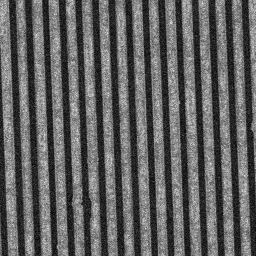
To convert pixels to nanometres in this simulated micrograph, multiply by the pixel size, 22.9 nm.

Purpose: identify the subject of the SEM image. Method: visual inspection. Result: parallel lines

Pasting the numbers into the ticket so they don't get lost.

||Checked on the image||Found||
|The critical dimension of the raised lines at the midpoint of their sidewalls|211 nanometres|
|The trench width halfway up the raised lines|168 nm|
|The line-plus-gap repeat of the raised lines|380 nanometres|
